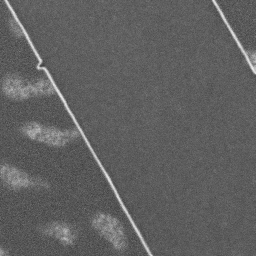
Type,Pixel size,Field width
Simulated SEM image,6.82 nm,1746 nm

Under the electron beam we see one or a few lines or trenches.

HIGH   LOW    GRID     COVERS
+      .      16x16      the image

+.............++
+.............++
++.............+
++.............+
+++.............
++++............
++++............
+++++...........
+++++...........
++++++..........
++++++..........
+++++++.........
++++++++........
++++++++........
+++++++++.......
+++++++++.......